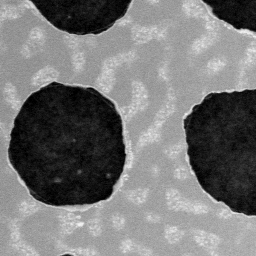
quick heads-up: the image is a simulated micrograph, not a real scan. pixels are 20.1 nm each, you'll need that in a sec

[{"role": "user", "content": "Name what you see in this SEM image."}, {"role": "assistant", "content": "holes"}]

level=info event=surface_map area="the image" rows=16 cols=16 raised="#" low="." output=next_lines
##......#####...
###....#######..
################
################
################
###...##########
#......#####....
#.......####....
#.......####....
#.......####....
#.......####....
##.....#####....
##....########..
################
################
################